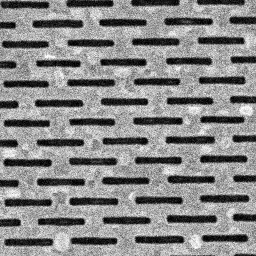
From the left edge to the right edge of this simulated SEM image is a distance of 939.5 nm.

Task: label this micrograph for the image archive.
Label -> a regular array of holes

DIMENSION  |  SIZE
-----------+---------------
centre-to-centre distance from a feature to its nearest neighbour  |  0.138 microns